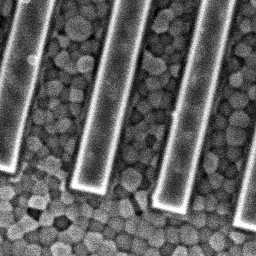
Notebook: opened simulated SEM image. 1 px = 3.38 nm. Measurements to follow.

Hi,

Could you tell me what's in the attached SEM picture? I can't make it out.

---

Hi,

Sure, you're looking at one or a few lines or trenches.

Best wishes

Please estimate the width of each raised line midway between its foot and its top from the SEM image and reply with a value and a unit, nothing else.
0.108 microns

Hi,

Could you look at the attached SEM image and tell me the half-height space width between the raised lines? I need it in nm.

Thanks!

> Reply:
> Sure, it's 178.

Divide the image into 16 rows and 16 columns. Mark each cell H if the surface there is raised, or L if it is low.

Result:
LHHLLLLHHLLLLHLL
LHHLLLLHHLLLHHLL
LHHLLLLHHLLLHHLL
HHHLLLHHHLLLHHLL
HHLLLLHHLLLLHHLL
HHLLLLHHLLLHHLLL
HHLLLLHHLLLHHLLL
HHLLLLHHLLLHHLLL
HLLLLHHLLLLHHLLL
HLLLLHHLLLHHLLLL
HLLLLHHLLLHHLLLL
LLLLLHHLLLHHLLLH
LLLLLLLLLLHHLLLH
LLLLLLLLLLLLLLLH
LLLLLLLLLLLLLLLL
LLLLLLLLLLLLLLLL